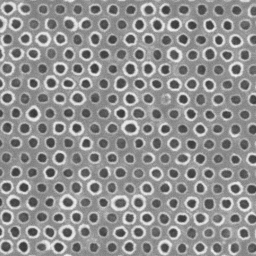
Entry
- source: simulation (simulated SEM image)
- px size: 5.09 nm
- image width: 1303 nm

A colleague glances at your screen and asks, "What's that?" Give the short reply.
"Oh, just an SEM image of a regular array of holes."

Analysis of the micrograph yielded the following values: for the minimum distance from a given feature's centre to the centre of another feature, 85.3 nanometres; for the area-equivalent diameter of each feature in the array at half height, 48.1 nm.